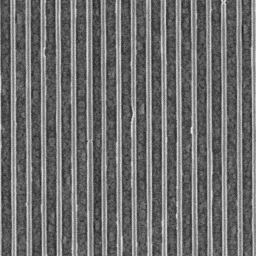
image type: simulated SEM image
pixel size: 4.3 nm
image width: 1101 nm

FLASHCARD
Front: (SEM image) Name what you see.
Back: parallel lines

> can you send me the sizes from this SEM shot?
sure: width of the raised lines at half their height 0.0188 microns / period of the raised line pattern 64.9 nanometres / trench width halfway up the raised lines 45.2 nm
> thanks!